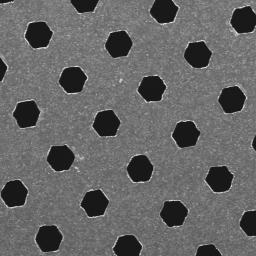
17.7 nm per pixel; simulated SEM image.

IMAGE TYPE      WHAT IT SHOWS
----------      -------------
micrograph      a regular array of holes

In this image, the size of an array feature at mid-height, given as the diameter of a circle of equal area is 469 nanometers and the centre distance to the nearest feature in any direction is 0.985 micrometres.